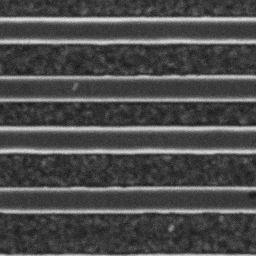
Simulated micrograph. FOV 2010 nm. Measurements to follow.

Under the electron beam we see lines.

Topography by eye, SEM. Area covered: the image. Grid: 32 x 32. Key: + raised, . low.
................................
................................
++++++++++++++++++++++++++++++++
++++++++++++++++++++++++++++++++
++++++++++++++++++++++++++++++++
................................
................................
................................
................................
................................
++++++++++++++++++++++++++++++++
++++++++++++++++++++++++++++++++
++++++++++++++++++++++++.+++++++
................................
................................
................................
++++++++++++++++++++++++++++++++
++++++++++++++++++++++++++++++++
++++++++++++++++++++++++++++++++
................................
................................
................................
................................
................++.+++++++++++..
++++++++++++++++++++++++++++++++
++++++++++++++++++++++++++++++++
..+++++++++.+++++...............
................................
................................
................................
................................
................................